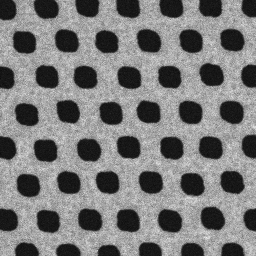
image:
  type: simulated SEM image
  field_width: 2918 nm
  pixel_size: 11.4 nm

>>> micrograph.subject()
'a regular array of holes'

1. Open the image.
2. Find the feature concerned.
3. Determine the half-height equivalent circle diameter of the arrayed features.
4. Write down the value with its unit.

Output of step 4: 274 nm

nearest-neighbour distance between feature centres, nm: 450